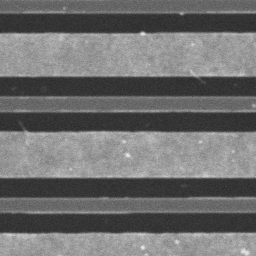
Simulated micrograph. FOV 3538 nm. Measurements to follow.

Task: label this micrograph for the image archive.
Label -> lines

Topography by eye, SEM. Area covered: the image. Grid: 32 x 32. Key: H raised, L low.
HHHHHHHHHHHHHHHHHHHHHHHHHHHHHHHH
HHHHHHHHHHHHHHHHHHHHHHHHHHHHHHHH
LLLLLLLLLLLLLLLLLLLLLLLLLLLLLLLL
LLLLLLLLLLLLLLLLLLLLLLLLLLLLLLLL
HHHHHHHHHHHHHHHHHHHHHHHHHHHHHHHH
HHHHHHHHHHHHHHHHHHHHHHHHHHHHHHHH
HHHHHHHHHHHHHHHHHHHHHHHHHHHHHHHH
HHHHHHHHHHHHHHHHHHHHHHHHHHHHHHHH
HHHHHHHHHHHHHHHHHHHHHHHHHHHHHHHH
HHHHHHHHHHHHHHHHHHHHHHHHHHHHHHHH
LLLLLLLLLLLLLLLLLLLLLLLLLLLLLLLL
LLLLLLLLLLLLLLLLLLLLLLLLLLLLLLLL
HHHHHHHHHHHHHHHHHHHHHHHHHHHHHHHH
HHHHHHHHHHHHHHHHHHHHHHHHHHHHHHHH
LLLLLLLLLLLLLLLLLLLLLLLLLLLLLLLL
LLLLLLLLLLLLLLLLLLLLLLLLLLLLLLLL
HHLHLLLLLLHHHHHHLHHLLLLLLLLLLLLL
HHHHHHHHHHHHHHHHHHHHHHHHHHHHHHHH
HHHHHHHHHHHHHHHHHHHHHHHHHHHHHHHH
HHHHHHHHHHHHHHHHHHHHHHHHHHHHHHHH
HHHHHHHHHHHHHHHHHHHHHHHHHHHHHHHH
HHHHHHHHHHHHHHHHHHHHHHHHHHHHHHHH
LLLLLLLLLLLLLLLLLLLLLLLLLLLLLLLL
LLLLLLLLLLLLLLLLLLLLLLLLLLLLLLLL
LLLLLLLLLLLLLLLLLLLLLLLLLLLLLLLL
HHHHHHHHHHHHHHHHHHHHHHHHHHHHHHHH
HHHHHHHHHHHHHHHHHHHHHHHHHHHHHHHH
LLLLLLLLLLLLLLLLLLLLLLLLLLLLLLLL
LLLLLLLLLLLLLLLLLLLLLLLLLLLLLLLL
HHHHHHHHHHHHHHHHHHHHHHHHHHHHHHHH
HHHHHHHHHHHHHHHHHHHHHHHHHHHHHHHH
HHHHHHHHHHHHHHHHHHHHHHHHHHHHHHHH